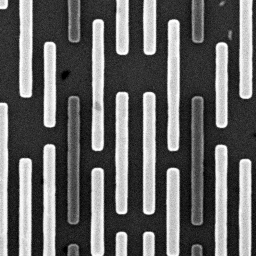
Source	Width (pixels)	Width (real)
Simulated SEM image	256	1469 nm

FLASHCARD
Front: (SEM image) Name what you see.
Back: wiring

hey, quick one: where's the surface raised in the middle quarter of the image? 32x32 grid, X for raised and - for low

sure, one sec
-------XXX----------------XXX---
-------XXX----------------XXX---
-------XXX----------------XXX---
-------XXX----------------XXX---
-------XXX----------------XXX---
-------XXX----------------XXX---
-------XXX----------------XXX---
-------XXX---XXX----XX----XXX---
--X----XXX---XXX----XXX---XXX---
-XXX---XXX---XXX----XXX---XXX---
-XXX---XXX---XXX----XXX---XXX---
-XXX---XXX---XXX----XXX---XXX---
-XXX---XXX---XXX----XXX---XXX---
-XXX---XXX---XXX----XXX---XXX---
-XXX---XXX---XXX----XXX---XXX---
-XXX---XXX---XXX----XXX---XXX---
-XXX---XXX---XXX----XXX---XXX---
-XXX---XXX---XXX----XXX---XXX---
-XXX---XXX---XXX----XXX---XXX---
-XXX---XXX---XXX----XXX---XXX---
-XXX---XXX---XXX----XXX---XXX---
-XXX----X----XXX----XXX---XX----
-XXX---------XXX----XXX---------
-XXX---------XXX----XXX---------
-XXX---------XXX----XXX---------
-XXX---------XXX----XX----------
-XXX---XX----XXX----XX----XX----
-XXX---XXX---XXX----XX----XXX---
-XXX---XXX---XXX----XX----XXX---
-XXX---XXX---XXX----XX----XXX---
-XXX---XXX---XXX----XX----XXX---
-XXX---XXX---XXX----XX----XXX---